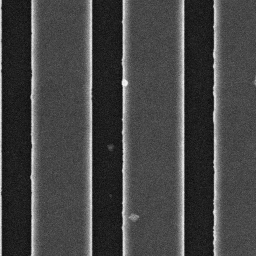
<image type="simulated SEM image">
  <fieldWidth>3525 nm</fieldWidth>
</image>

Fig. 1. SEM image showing lines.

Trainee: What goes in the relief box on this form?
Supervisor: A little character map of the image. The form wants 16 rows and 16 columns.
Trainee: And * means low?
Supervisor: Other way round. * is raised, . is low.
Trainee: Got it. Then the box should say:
..****..***..***
..****..***..***
..****..***..***
..****..***..***
..****..***..***
..****..***..***
..****..***..***
..****..***..***
..****..***..***
..****..***..***
..****..***..***
..****..***..***
..****..***..***
..****..***..***
..****..***..***
..****..***..***